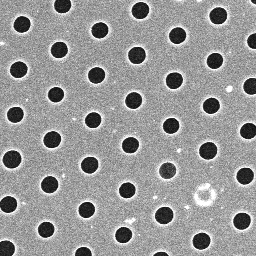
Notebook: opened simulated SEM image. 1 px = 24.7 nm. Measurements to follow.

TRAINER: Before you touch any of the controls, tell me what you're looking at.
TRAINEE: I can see a regular array of holes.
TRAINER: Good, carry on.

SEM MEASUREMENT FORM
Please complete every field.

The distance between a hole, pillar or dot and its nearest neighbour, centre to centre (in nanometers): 1110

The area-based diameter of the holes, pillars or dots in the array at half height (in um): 0.428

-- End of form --